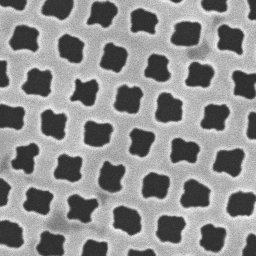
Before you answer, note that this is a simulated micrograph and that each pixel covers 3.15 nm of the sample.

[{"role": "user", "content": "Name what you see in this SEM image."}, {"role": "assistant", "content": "a regular array of holes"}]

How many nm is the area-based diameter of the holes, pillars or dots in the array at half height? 85.9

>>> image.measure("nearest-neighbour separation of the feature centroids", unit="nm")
136